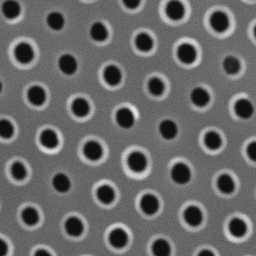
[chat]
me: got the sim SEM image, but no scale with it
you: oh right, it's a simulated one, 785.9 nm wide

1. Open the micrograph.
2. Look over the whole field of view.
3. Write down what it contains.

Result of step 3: a regular array of holes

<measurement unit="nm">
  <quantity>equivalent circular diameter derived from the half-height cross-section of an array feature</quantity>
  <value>56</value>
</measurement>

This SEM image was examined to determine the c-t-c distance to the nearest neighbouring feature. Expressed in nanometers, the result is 137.